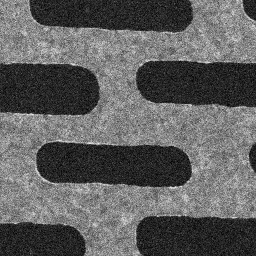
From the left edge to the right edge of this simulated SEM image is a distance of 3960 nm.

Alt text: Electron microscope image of holes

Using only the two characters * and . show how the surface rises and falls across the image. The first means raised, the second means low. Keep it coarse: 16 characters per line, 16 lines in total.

**..........***.
***.........****
****************
****************
......***.......
......***.......
......*****.....
****************
****************
**.........*****
**..........****
*******....*****
****************
**********..****
.....****.......
.....****.......